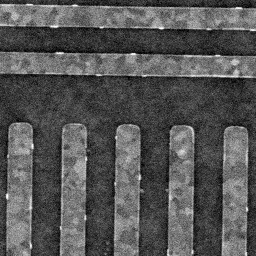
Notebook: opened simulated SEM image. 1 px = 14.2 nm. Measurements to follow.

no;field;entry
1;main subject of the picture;groups of lines, slits or small figures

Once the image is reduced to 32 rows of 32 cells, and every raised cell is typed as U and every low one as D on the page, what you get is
DDDDDDDDDDDDDDDDDDDDDDDDDDDDDDDD
UUUUUUUUUUUUUUUUUUUUUUUUUUUUUUUU
UUUUUUUUUUUUUUUUUUUUUUUUUUUUUUUU
DDDDDDDDDDDDDDDDDDDDDDDDUUUUUUUU
DDDDDDDDDDDDDDDDDDDDDDDDDDDDDDDD
DDDDDDDDDDDDDDDDDDDDDDDDDDDDDDDD
DDDDDDDDDDDDDDDDDDDDDDDDDDDDDDDD
UUUUUUUUUUUUUUUUUUUUUUUUUUUUUUUU
UUUUUUUUUUUUUUUUUUUUUUUUUUUUUUUU
DDDDDDDDDDDDDDDDDDDDDDDDDDDDUUUU
DDDDDDDDDDDDDDDDDDDDDDDDDDDDDDDD
DDDDDDDDDDDDDDDDDDDDDDDDDDDDDDDD
DDDDDDDDDDDDDDDDDDDDDDDDDDDDDDDD
DDDDDDDDDDDDDDDDDDDDDDDDDDDDDDDD
DDDDDDDDDDDDDDDDDDDDDDDDDDDDDDDD
DDUUDDDDDDDDDDDDDDDDDDDDDDDDDDDD
DUUUDDDDUUUDDDDUUDDDDUUUDDDDUUUD
DUUUDDDDUUUDDDDUUDDDDUUUDDDDUUUD
DUUUDDDDUUUDDDDUUDDDDUUUDDDDUUUD
DUUUDDDDUUUDDDDUUDDDDUUUDDDDUUUD
DUUUDDDDUUUDDDDUUDDDDUUUDDDDUUUD
DUUUDDDDUUUDDDUUUDDDDUUUDDDDUUUD
DUUUDDDDUUUDDDUUUDDDDUUUDDDDUUUD
DUUUDDDDUUUDDDUUUUDDDUUUDDDDUUUD
DUUUDDDDUUUDDDUUUDDDDUUUDDDDUUUD
DUUUDDDDUUUDDDUUUDDDDUUUDDDDUUUD
DUUUDDDDUUUDDDUUUDDDDUUUDDDDUUUD
DUUUDDDDUUUDDDUUUDDDDUUUDDDDUUUD
DUUUDDDDUUUDDDUUUDDDDUUUDDDDUUUD
DUUUDDDDUUDDDDUUUDDDDUUUDDDDUUUD
DUUUDDDDUUDDDDUUUDDDDUUUDDDDUUUD
DUUUDDDDUUDDDDUUUDDDDUUUDDDDUUUD